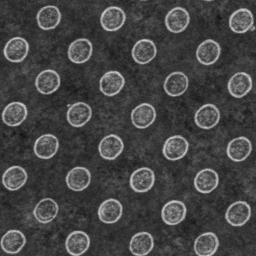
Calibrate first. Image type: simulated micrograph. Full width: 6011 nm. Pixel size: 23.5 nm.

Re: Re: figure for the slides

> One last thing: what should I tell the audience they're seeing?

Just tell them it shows a regular array of raised bodies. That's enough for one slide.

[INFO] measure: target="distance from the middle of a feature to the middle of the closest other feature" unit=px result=45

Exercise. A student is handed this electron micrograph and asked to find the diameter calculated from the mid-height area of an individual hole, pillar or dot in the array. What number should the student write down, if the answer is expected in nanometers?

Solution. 520